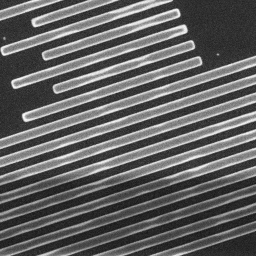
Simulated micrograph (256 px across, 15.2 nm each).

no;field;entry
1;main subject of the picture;groups of lines, slits or small figures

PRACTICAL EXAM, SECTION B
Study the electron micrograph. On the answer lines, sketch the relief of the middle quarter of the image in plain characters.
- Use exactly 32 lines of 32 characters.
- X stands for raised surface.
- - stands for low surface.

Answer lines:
XXXXX--------XXXXXX-------XXXXXX
XX--------XXXXXXX-------XXXXXXX-
--------XXXXX-------XXXXXXX-----
---XXXXXX--------XXXXXXX-------X
XXXXXXX-------XXXXXXX-------XXXX
XXXX-------XXXXXXX--------XXXXXX
X-------XXXXXXX-------XXXXXXX---
-----XXXXXXX-------XXXXXX-------
--XXXXXXX-------XXXXXXX-------XX
XXXXXX------XXXXXXXX-------XXXXX
XXX-------XXXXXXX-------XXXXXXX-
-------XXXXXX--------XXXXXXX----
----XXXXXX--------XXXXXXX-------
XXXXXXXX-------XXXXXXX------XXXX
XXXXX-------XXXXXXX-------XXXXXX
XX-------XXXXXXX-------XXXXXXX--
-----XXXXXXX-------XXXXXXX------
--XXXXXXX-------XXXXXXX-------XX
XXXXXX-------XXXXXXXX-------XXXX
XXX-------XXXXXXX-------XXXXXXX-
-------XXXXXXX-------XXXXXXX----
----XXXXXXX-------XXXXXXX-------
--XXXXXX-------XXXXXXXX------XXX
XXXXX-------XXXXXXX-------XXXXXX
XX--------XXXXXX-------XXXXXXX--
------XXXXXXX-------XXXXXXX-----
--XXXXXXX--------XXXXXXX-------X
XXXXXXX-------XXXXXXX-------XXXX
XXXX-------XXXXXXX-------XXXXXXX
X--------XXXXXX-------XXXXXX----
-----XXXXXXX-------XXXXXXX------
--XXXXXX--------XXXXXXX-------XX